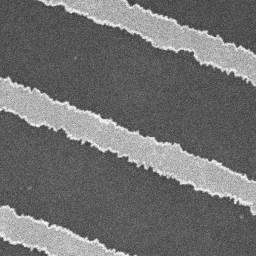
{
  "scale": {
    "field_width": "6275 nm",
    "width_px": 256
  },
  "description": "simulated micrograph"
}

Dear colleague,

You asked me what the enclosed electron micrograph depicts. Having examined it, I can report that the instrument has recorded one or a few lines or trenches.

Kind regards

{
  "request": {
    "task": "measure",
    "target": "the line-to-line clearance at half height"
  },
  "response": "2.24 µm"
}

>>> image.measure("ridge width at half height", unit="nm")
646